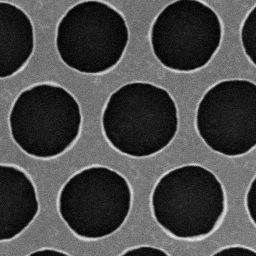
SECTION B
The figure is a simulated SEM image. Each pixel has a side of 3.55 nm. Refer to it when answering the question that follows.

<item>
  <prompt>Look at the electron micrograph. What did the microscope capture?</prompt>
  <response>holes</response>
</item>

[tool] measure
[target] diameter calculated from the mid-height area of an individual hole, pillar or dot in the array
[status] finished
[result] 258 nanometres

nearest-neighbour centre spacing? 335 nanometres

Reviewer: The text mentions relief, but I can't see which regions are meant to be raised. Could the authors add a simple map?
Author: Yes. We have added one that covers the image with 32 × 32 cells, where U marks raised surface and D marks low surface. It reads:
DUUUUUUUUUDDDUUUUUUUUDDDDUUUUUUU
DDDUUUUUDDDDDDDUUUUUDDDDDDDUUUUD
DDDDUUUUDDDDDDDUUUUDDDDDDDDUUUUD
DDDDUUUDDDDDDDDDUUUDDDDDDDDDUUDD
DDDDUUUDDDDDDDDDUUUDDDDDDDDDUUDD
DDDDUUUDDDDDDDDDUUUDDDDDDDDUUUDD
DDDDUUUDDDDDDDDUUUUDDDDDDDDUUUUD
DDDUUUUUDDDDDDDUUUUUDDDDDDUUUUUD
DDDUUUUUUDDDDDUUUUUUUDDDDUUUUUUU
DUUUUUUUUUUUUUUUUUUUUUUUUUUUUUUU
UUUUUDDUUUUUUUUUDDUUUUUUUUUDDDDD
UUUDDDDDUUUUUUDDDDDDDUUUUUDDDDDD
UUDDDDDDDUUUUUDDDDDDDDUUUDDDDDDD
UUDDDDDDDDUUUDDDDDDDDDUUUDDDDDDD
UDDDDDDDDDUUUDDDDDDDDDUUUDDDDDDD
UDDDDDDDDDUUUDDDDDDDDDUUUDDDDDDD
UDDDDDDDDDUUUDDDDDDDDDUUUDDDDDDD
UUDDDDDDDUUUUUDDDDDDDUUUUUDDDDDD
UUUDDDDDDUUUUUUDDDDDUUUUUUDDDDDD
UUUUDDDUUUUUUUUUUDUUUUUUUUUUUUUU
UUUUUUUUUUUUUUUUUUUUUUUUUUUUUUUU
DDDUUUUUUUDDDDUUUUUUUDDDDDUUUUUU
DDDDUUUUUDDDDDDDUUUUDDDDDDDUUUUU
DDDDUUUUDDDDDDDDUUUDDDDDDDDDUUUD
DDDDUUUUDDDDDDDDUUUDDDDDDDDDUUUD
DDDDDUUDDDDDDDDDUUUDDDDDDDDDUUUD
DDDDDUUUDDDDDDDDUUUDDDDDDDDDUUUD
DDDDUUUUDDDDDDDDUUUUDDDDDDDDUUUU
DDDUUUUUUDDDDDDUUUUUDDDDDDDUUUUU
DDUUUUUUUUDDDUUUUUUUUUDDDUUUUUUU
UUUUUUUUUUUUUUUUUUUUUUUUUUUUUUUU
UUUUDDDDUUUUUUUUDDDDDUUUUUUDDDDD